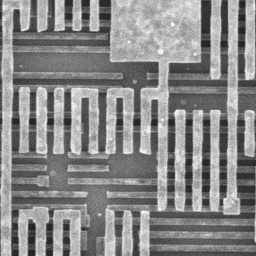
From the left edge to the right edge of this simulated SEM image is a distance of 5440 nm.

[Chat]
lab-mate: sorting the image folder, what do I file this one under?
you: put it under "wiring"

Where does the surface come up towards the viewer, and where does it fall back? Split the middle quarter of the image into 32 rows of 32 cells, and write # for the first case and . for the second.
........................##......
........................##......
........................##......
........................##......
........................##......
........................##......
..######...######..#######......
..######...######..#######......
..##..##...##..##..#######......
..##..##...##..##..###..##......
..##..##...##..##..###..##......
..##..##...##..##..###..##..#...
..##..##...##..##..###..##..##..
..##..##...##..##..###..##..##..
..##..##...##..##..###..##..##..
..##..##...##..##..##...##..##..
..##..##...##..##..##...##..##..
..##..##...##..##..##...##..##..
..##..##...##..##..##...##..##..
..##..##...##..##..##...##..##..
..##..##...##..##..##...##..##..
..##..##...##..##..###..##..##..
........................##..##..
........................##..##..
........................##..##..
........................##..##..
........................##..##..
........................##..##..
........................##..##..
........................##..##..
........................##..##..
.......................###..##..